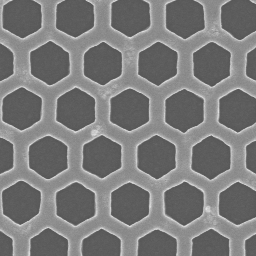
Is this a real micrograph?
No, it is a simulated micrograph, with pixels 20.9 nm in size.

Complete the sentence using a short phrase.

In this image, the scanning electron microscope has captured a regular array of holes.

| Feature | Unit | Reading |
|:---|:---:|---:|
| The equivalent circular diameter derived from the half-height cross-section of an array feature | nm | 847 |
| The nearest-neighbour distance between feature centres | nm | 1110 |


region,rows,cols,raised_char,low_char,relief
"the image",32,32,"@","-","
@----@@----@@@----@@@----@@@----
-----@@-----@@-----@@----@@@----
-----@@-----@@-----@@-----@@----
@----@@----@@@----@@@----@@@----
@@--@@@@@-@@@@@@-@@@@@--@@@@@--@
@@@@@@-@@@@@-@@@@@@-@@@@@@-@@@@@
-@@@----@@@----@@@----@@-----@@-
--@@-----@-----@@-----@@-----@@-
--@@-----@-----@@-----@@-----@@-
-@@@----@@@----@@@----@@-----@@-
@@@@@@-@@@@@-@@@@@@-@@@@@@-@@@@@
@@--@@@@---@@@@--@@@@@--@@@@@--@
-----@@-----@@-----@@----@@@----
-----@@-----@@-----@@-----@-----
-----@@-----@@-----@@-----@-----
@---@@@@---@@@----@@@----@@@----
@@@@@@@@@@@@@@@@@@@@@@@@@@@@@@@@
-@@@@--@@@@@--@@@@---@@@@---@@@@
--@@----@@-----@@-----@@-----@@-
--@@----@@-----@@-----@@-----@@-
--@@----@@-----@@-----@@-----@@-
-@@@----@@@---@@@@---@@@@---@@@@
@@@@@@@@@@@@@@@@@@@@@@@@@@@@@@@@
@---@@@@---@@@@---@@@----@@@---@
-----@@-----@@-----@-----@@-----
-----@@-----@@-----@@----@@-----
-----@@-----@@-----@@----@@-----
@---@@@@---@@@@---@@@@--@@@@---@
@@@@@@@@@@@@@@@@@@@@@@@@@@@@@@@@
-@@@----@@@---@@@@---@@@@---@@@@
--@@-----@-----@@-----@@-----@@-
--@@----@@-----@@-----@@-----@@-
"